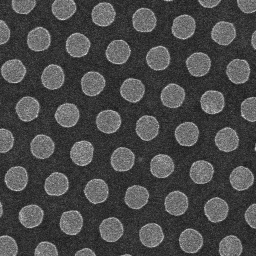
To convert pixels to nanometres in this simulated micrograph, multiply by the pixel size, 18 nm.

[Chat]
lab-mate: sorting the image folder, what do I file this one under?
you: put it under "a regular array of raised bodies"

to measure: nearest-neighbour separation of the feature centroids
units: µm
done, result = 0.721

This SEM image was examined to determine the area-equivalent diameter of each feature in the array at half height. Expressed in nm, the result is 431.